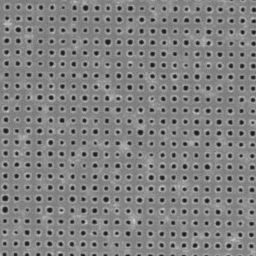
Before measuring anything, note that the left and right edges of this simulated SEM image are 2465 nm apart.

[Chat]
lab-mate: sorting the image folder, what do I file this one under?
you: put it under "a regular array of holes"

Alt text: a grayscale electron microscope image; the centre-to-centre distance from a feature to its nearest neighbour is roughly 105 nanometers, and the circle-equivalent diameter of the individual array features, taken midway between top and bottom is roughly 0.0435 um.